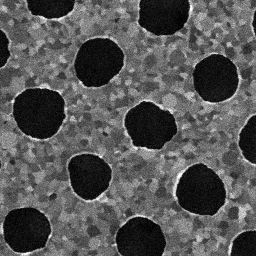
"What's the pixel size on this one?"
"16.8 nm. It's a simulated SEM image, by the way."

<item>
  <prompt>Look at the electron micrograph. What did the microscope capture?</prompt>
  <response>holes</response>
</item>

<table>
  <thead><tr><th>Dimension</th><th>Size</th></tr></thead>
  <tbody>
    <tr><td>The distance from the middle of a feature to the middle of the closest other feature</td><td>1320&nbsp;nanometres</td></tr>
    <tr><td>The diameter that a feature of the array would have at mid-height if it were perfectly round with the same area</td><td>842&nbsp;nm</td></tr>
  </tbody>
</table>